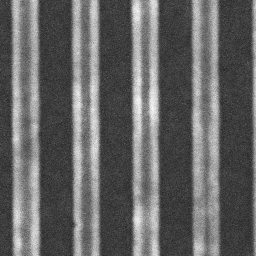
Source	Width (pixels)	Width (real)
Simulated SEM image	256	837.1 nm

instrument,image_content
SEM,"parallel lines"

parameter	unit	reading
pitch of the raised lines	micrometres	0.196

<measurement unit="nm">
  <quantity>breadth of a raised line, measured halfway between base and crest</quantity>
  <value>67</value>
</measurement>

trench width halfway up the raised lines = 128 nm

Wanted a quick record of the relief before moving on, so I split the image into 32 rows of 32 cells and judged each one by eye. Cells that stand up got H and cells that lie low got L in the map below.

LLHHLLLLLHHHLLLLLHHLLLLLHHHLLLLL
LLHHLLLLLHHHLLLLLHHLLLLLHHHLLLLL
LLHHLLLLLHHHLLLLLHHLLLLLHHHLLLLL
LLHHLLLLLHHHLLLLLHHLLLLLHHHLLLLL
LLHHLLLLLHHHLLLLLHHLLLLLHHHLLLLL
LLHHLLLLLHHHLLLLLHHLLLLLHHHLLLLL
LLHHLLLLLHHHLLLLLHHLLLLLHHHLLLLL
LLHHLLLLLHHHLLLLLHHLLLLLHHHLLLLL
LLHHLLLLLHHHLLLLLHHLLLLLHHHLLLLL
LLHHLLLLLHHHLLLLLHHLLLLLHHHLLLLL
LLHHLLLLLHHHLLLLLHHLLLLLHHHLLLLL
LLHHLLLLLHHHLLLLLHHLLLLLHHHLLLLL
LLHHLLLLLHHHLLLLLHHLLLLLHHHLLLLL
LLHHLLLLLHHHLLLLLHHLLLLLHHHLLLLL
LLHHLLLLLHHHLLLLLHHLLLLLHHHLLLLL
LLHHLLLLLHHHLLLLLHHLLLLLHHHLLLLL
LLHHLLLLLLHHLLLLLHHLLLLLHHHLLLLL
LLHHLLLLLLHHLLLLLHHHLLLLHHHLLLLL
LLHHLLLLLLHHLLLLLHHLLLLLHHHLLLLL
LLHHLLLLLLHHLLLLLHHLLLLLHHHLLLLL
LLHHLLLLLLHHLLLLLHHLLLLLHHHLLLLL
LLHHHLLLLLHHLLLLLHHLLLLLHHHLLLLL
LLHHHLLLLLHHLLLLLHHHLLLLHHHLLLLL
LLHHHLLLLLHHLLLLLHHHLLLLHHHLLLLL
LLHHHLLLLLHHLLLLLHHHLLLLLHHLLLLL
LLHHHLLLLLHHLLLLLHHLLLLLLHHLLLLL
LLHHHLLLLLHHLLLLLHHLLLLLHHHLLLLL
LLHHHLLLLLHHLLLLLHHLLLLLLHHLLLLL
LLHHHLLLLLHHLLLLLHHLLLLLLHHLLLLL
LLHHHLLLLLHHLLLLLHHLLLLLLHHLLLLL
LLHHHLLLLLHHLLLLLHHLLLLLLHHLLLLL
LLHHHLLLLLHHLLLLLHHLLLLLLHHLLLLL